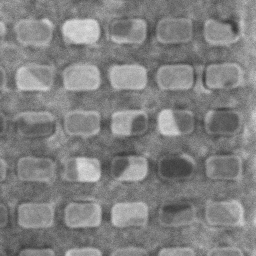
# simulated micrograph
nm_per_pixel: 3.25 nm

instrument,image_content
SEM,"a regular array of raised bodies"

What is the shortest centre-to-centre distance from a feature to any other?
148 nm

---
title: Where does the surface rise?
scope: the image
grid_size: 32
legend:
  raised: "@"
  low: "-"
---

--------------------------------
--------------------------------
----------------@@--@@@---------
--@@@@--@@@@--@@@@--@@@@--@@@@--
@-@@@@--@@@@--@@@@--@@@@--@@@@--
--------------------------------
--------------------------------
--------------------------------
---@@@---@@@--@@@@--@@@@--@@@@--
@-@@@@--@@@@--@@@@--@@@@--@@@@--
@-@@@@--@@@@--@@@@--@@@@--@@@@--
--------------------------------
--------------------------------
--------------------------------
---@@@--@@@@--@@@@--@@@@--@@@@--
@-@@@@@-@@@@--@@@@--@@@@--@@@@--
--@@@@--@@@@--@@@@--@@@@--@@@@--
--------------------------------
--------------------------------
--------------------------------
@-@@@@@-@@@@--@@@@--@@@@--@@@@--
@-@@@@@-@@@@--@@@@--@@@@--@@@@--
---@@@---@@@----@---------------
--------------------------------
--------------------------------
-----------@-----@---@@@--@@@@--
@-@@@@@-@@@@@-@@@@--@@@@--@@@@--
@-@@@@@-@@@@@-@@@@--@@@@--@@@@--
--------------------------------
--------------------------------
--------------------------------
---@@@---@@@--@@@@--@@@@--@@@@--